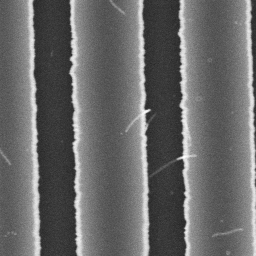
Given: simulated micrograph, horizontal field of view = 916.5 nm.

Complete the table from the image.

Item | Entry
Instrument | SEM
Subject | lines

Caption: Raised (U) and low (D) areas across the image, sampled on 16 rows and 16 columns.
UUDDUUUUUDDUUUUU
UUDDUUUUUDDUUUUU
UUDDUUUUUDDUUUUU
UUDDUUUUUDDUUUUU
UUDDUUUUUDDUUUUU
UUDDDUUUUDDUUUUU
UUDDDUUUUDDUUUUU
UUDDDUUUUDDUUUUU
UUDDDUUUUDDUUUUU
UUDDDUUUUDDUUUUU
UUDDDUUUUDDUUUUU
UUDDDUUUUDDDUUUU
UUDDDUUUUDDDUUUU
UUDDDUUUUDDDUUUU
UUDDDUUUUDDDUUUU
UUDDDUUUUDDDUUUU